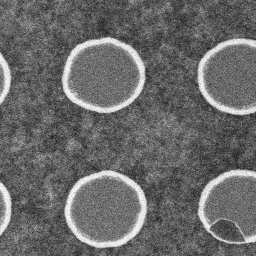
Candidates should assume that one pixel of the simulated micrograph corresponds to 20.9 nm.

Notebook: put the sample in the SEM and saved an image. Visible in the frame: raised bodies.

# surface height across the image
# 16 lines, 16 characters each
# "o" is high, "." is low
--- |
................
................
................
.....ooo.....ooo
....ooooo...oooo
....ooooo....ooo
.....ooo.....ooo
................
................
................
................
.....ooo.....ooo
....ooooo....ooo
....ooooo....ooo
.....ooo.......o
................